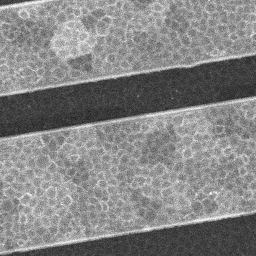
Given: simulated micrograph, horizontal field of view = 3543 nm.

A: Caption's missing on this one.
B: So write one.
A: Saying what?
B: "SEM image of one or a few lines or trenches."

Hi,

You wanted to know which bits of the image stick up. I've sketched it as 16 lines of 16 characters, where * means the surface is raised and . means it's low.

****************
****************
****************
***************.
*********.......
***.............
..............**
........********
..**************
****************
****************
****************
****************
**************..
********........
**..............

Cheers